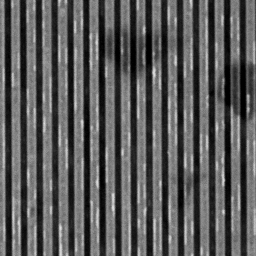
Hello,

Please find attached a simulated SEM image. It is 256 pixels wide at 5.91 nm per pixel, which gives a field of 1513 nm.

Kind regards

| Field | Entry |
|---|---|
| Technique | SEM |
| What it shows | parallel lines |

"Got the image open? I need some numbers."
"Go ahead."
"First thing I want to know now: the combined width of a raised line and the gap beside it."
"0.0927 um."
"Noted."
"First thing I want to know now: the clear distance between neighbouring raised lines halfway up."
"41.4 nanometres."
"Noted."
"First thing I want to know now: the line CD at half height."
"8.88 px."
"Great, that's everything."